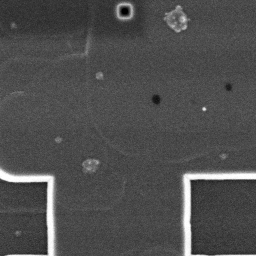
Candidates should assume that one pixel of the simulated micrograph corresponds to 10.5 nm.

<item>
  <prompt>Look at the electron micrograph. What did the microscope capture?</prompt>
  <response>wiring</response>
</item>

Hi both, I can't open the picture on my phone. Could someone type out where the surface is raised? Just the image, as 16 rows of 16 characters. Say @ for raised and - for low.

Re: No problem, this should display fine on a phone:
@@@@@@@@@@@@@@@@
@@@@@@@@@@@@@@@@
@@@@@@@@@@@@@@@@
@@@@@@@@@@@@@@@@
@@@@@@@@@@@@@@@@
@@@@@@@@@@@@@@@@
@@@@@@@@@@@@@@@@
@@@@@@@@@@@@@@@@
@@@@@@@@@@@@@@@@
@@@@@@@@@@@@@@@@
@@@@@@@@@@@@@@@@
---@@@@@@@@@----
---@@@@@@@@@----
---@@@@@@@@@----
---@@@@@@@@@----
---@@@@@@@@@----